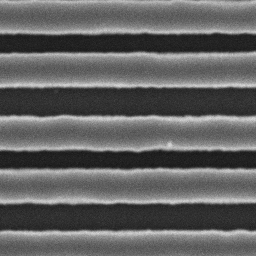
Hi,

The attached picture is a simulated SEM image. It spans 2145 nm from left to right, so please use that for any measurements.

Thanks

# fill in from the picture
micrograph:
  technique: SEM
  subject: lines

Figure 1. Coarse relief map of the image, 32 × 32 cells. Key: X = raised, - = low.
XXXXXXXXXXXXXXXXXXXXXXXXXXXXXXXX
XXXXXXXXXXXXXXXXXXXXXXXXXXXXXXXX
XXXXXXXXXXXXXXXXXXXXXXXXXXXXXXXX
XXXXXXXXXXXXXXXXXXXXXXXXXXXXXXXX
--------------------------------
--------------------------------
--------------------------------
XXXXXXXXXXXXXXXXXXXXXXXXXXXXXXXX
XXXXXXXXXXXXXXXXXXXXXXXXXXXXXXXX
XXXXXXXXXXXXXXXXXXXXXXXXXXXXXXXX
XXXXXXXXXXXXXXXXXXXXXXXXXXXXXXXX
--------------------------------
--------------------------------
--------------------------------
-XXX---XX----------X------XX----
XXXXXXXXXXXXXXXXXXXXXXXXXXXXXXXX
XXXXXXXXXXXXXXXXXXXXXXXXXXXXXXXX
XXXXXXXXXXXXXXXXXXXXXXXXXXXXXXXX
XXXXXXXXXXXXXXXXXXXXXXXXXXXXXXXX
--------------------------------
--------------------------------
XXXXXXXXXXXXXXXXXXXXXXXXXXXXXXXX
XXXXXXXXXXXXXXXXXXXXXXXXXXXXXXXX
XXXXXXXXXXXXXXXXXXXXXXXXXXXXXXXX
XXXXXXXXXXXXXXXXXXXXXXXXXXXXXXXX
--------------------------------
--------------------------------
--------------------------------
--------------------------------
XXXXXXXXXXXXXXXXXXXXXXXXXXXXXXXX
XXXXXXXXXXXXXXXXXXXXXXXXXXXXXXXX
XXXXXXXXXXXXXXXXXXXXXXXXXXXXXXXX